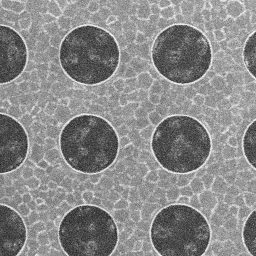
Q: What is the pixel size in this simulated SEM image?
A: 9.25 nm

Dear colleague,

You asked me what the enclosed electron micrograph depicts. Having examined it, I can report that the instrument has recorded holes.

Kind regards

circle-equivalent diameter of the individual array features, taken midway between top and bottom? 0.551 microns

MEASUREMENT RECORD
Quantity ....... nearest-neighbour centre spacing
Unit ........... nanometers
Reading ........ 828